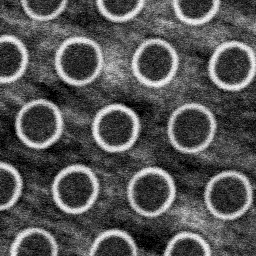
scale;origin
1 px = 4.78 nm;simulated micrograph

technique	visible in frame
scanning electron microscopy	a regular array of raised bodies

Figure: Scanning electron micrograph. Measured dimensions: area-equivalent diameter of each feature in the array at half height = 214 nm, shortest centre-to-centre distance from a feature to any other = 0.356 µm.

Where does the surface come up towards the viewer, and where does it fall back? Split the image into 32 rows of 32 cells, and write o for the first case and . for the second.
...ooooo....oooooo....ooooo.....
...oooo......oooo.....ooooo.....
.......................ooo......
................................
................................
ooo.....oooo......ooo........o..
ooo....ooooo.....ooooo.....oooo.
ooo....oooooo....ooooo.....ooooo
ooo....ooooo.....ooooo....oooooo
oo......oooo.....oooo.....oooooo
..................oo.......oooo.
................................
................................
...oooo......ooo.......oo.......
..ooooo.....ooooo.....oooo......
..oooooo....ooooo....oooooo.....
..ooooo.....ooooo....oooooo.....
...oooo.....ooooo....ooooo......
.............ooo......ooo.......
................................
................................
oo......ooo.......oo............
oo.....ooooo.....oooo......oooo.
oo.....ooooo....oooooo....ooooo.
oo.....ooooo....oooooo....ooooo.
o......oooo......oooo.....ooooo.
.........o........oo.......ooo..
................................
................................
..oooo.......ooo......oo........
..ooooo.....ooooo....ooooo......
..ooooo....oooooo....ooooo......